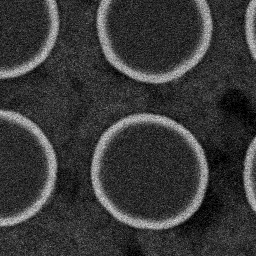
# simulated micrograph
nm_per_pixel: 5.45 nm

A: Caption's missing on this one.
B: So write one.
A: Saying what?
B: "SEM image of raised bodies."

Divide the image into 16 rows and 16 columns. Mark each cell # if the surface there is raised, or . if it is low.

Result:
###...#######...
###...#######...
###...#######...
###....#####....
#.......###.....
................
................
#.......##......
###....#####....
###...#######...
###...#######..#
###...#######..#
###...######....
##.....#####....
................
................